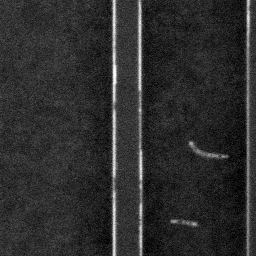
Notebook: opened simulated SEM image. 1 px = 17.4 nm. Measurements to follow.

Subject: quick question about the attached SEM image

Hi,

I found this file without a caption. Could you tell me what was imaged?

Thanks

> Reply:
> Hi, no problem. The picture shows lines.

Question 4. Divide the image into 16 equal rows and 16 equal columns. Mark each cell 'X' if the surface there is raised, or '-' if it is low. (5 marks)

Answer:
-------XX-------
-------XX-------
-------XX-------
-------XX-------
-------XX-------
-------XX-------
-------XX-------
-------XX-------
-------XX-------
-------XX-------
-------XX-------
-------XX-------
-------XX-------
-------XX-------
-------XX-------
-------XX-------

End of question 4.